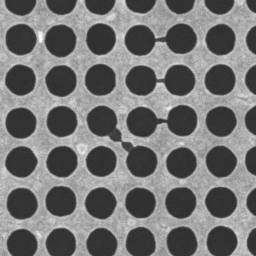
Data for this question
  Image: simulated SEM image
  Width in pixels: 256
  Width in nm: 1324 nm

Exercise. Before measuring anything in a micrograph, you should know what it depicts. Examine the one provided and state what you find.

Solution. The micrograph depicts a regular array of holes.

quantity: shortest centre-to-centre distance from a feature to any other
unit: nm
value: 205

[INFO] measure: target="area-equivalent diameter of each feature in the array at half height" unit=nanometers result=161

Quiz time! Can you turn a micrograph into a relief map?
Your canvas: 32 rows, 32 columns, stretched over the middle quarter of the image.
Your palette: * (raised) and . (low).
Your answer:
.******....*******..*******....*
..****......*****.....****......
...***.......***.......**.......
...**........**........**.......
...**........**.................
...**........***.......**.......
...***......****.......***......
.******....******....******....*
********************************
********************************
*********.******************...*
..*****.....*****.....*****.....
...***.......***.......***......
...***.......***........**......
...***........**................
...***.......***.......***......
...****.......**.......***......
..*****.......***.....******....
***********...******************
*************...****************
*********.****......************
..*****.....***.......******....
...***.......***.......***......
...***.......***.......***......
...**........***........**......
...***.......***.......***......
...***.......***.......***......
..*****.....*****.....*****.....
****************************...*
********************************
********************************
..*****....******....******.....